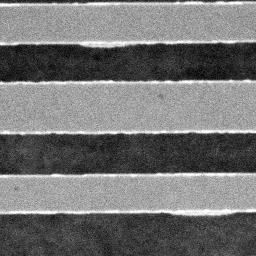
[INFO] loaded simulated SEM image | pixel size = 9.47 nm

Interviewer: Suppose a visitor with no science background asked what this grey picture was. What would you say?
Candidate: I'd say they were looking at lines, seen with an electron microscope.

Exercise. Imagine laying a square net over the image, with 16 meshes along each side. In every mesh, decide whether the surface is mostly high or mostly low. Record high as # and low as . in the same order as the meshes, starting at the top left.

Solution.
################
################
################
................
................
################
################
################
................
................
................
################
################
................
................
................